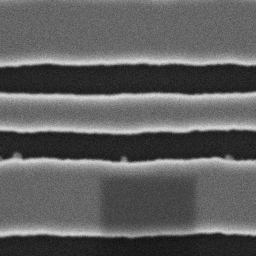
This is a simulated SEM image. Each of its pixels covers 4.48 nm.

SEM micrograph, lines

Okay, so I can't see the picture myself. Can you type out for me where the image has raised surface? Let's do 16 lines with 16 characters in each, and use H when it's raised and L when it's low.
HHHHHHHHHHHHHHHH
HHHHHHHHHHHHHHHH
HHHHHHHHHHHHHHHH
HHHHHHHHHHHHHHHH
LLLLLLLLLLLLLLLL
LLLLLLLLLLLLLLLL
HHHHHHHHHHHHHHHH
HHHHHHHHHHHHHHHH
LLLLLLLLLLLLLLLL
LLLLLLLLLLLLLLLL
HHHHHHHHHHHHHHHH
HHHHHHHHHHHHHHHH
HHHHHHHHHHHHHHHH
HHHHHHHHHHHHHHHH
HHHHHHHHHHHHHHHH
LLLLLLLLLLLLLLLL